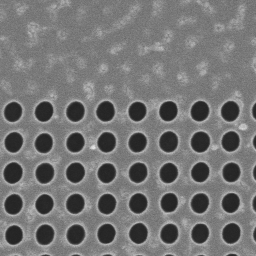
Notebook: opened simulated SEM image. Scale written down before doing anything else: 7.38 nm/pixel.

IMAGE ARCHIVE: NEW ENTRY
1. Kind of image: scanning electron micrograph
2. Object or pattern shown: a regular array of holes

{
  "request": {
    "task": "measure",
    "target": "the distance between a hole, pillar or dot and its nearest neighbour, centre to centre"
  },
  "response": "223 nm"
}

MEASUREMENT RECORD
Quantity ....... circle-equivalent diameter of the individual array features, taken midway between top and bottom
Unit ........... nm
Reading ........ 137